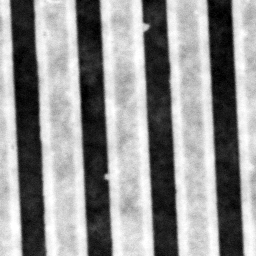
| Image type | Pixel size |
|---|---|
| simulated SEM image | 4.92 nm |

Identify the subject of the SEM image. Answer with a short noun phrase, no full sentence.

one or a few lines or trenches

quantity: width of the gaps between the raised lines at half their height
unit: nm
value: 172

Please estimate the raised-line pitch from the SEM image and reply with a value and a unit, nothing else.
323 nm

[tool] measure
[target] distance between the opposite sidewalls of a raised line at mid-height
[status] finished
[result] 150 nm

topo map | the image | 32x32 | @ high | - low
@----@@@@----@@@@----@@@@-----@@
@----@@@@----@@@@-----@@@-----@@
@----@@@@----@@@@-----@@@-----@@
@----@@@@----@@@@-----@@@-----@@
@----@@@@----@@@@-----@@@-----@@
@----@@@@----@@@@-----@@@-----@@
@----@@@@----@@@@-----@@@@----@@
@----@@@@-----@@@-----@@@@----@@
@----@@@@-----@@@-----@@@@----@@
@----@@@@-----@@@-----@@@@----@@
@-----@@@-----@@@@----@@@@----@@
@-----@@@-----@@@@----@@@@----@@
@-----@@@-----@@@@----@@@@----@@
@-----@@@-----@@@@----@@@@----@@
@-----@@@-----@@@@----@@@@----@@
@-----@@@-----@@@@----@@@@----@@
@-----@@@@----@@@@----@@@@----@@
@-----@@@@----@@@@----@@@@----@@
@@----@@@@----@@@@----@@@@-----@
@-----@@@@----@@@@----@@@@-----@
@@----@@@@----@@@@----@@@@-----@
@@----@@@@----@@@@-----@@@-----@
@@----@@@@----@@@@-----@@@-----@
@@----@@@@----@@@@-----@@@-----@
@@----@@@@----@@@@-----@@@-----@
@@----@@@@----@@@@-----@@@-----@
@@----@@@@----@@@@-----@@@-----@
@@----@@@@-----@@@-----@@@@----@
@@----@@@@-----@@@-----@@@@----@
@@----@@@@-----@@@-----@@@@----@
@@----@@@@-----@@@-----@@@@----@
@@-----@@@-----@@@@----@@@@----@